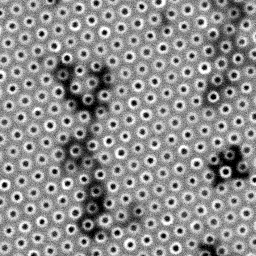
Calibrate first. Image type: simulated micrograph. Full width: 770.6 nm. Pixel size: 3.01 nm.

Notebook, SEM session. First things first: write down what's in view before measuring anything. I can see a regular array of holes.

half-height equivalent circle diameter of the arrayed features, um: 0.018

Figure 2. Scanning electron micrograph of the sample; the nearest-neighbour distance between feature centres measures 51 nanometres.